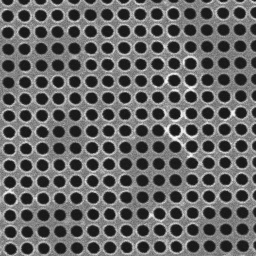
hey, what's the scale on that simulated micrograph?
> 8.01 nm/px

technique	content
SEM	a regular array of holes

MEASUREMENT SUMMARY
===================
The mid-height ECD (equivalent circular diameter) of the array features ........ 97.4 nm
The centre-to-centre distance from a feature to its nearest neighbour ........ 130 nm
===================